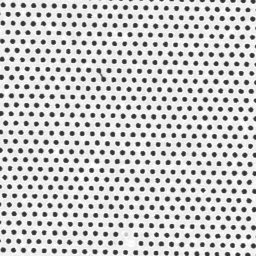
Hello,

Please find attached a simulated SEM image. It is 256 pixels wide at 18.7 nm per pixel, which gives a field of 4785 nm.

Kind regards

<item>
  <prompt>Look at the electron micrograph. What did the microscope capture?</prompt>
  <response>a regular array of holes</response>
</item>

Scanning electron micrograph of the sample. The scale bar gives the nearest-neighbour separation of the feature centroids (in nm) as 186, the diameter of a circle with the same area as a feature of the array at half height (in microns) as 0.101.